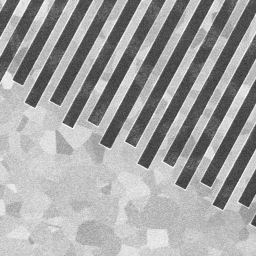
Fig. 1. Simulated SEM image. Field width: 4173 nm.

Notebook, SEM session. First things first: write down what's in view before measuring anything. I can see parallel lines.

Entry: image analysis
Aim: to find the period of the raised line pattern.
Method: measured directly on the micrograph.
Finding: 346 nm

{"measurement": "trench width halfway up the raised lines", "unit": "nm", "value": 206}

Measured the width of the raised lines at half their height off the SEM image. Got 146 nanometers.